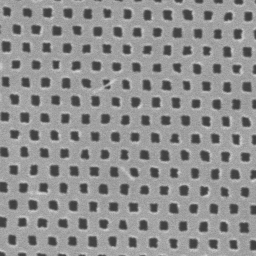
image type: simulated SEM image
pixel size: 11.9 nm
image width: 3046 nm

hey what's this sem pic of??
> a regular array of holes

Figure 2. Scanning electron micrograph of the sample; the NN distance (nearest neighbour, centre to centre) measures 234 nm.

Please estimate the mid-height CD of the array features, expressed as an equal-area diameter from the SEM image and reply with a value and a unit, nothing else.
0.122 micrometres